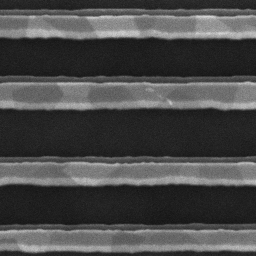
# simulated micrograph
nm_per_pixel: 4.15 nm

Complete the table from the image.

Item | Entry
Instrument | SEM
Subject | lines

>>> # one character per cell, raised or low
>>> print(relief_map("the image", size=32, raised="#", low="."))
................................
################################
################################
################################
################################
................................
................................
................................
................................
................................
################################
################################
################################
..##############......###..#####
................................
................................
................................
................................
................................
................................
################################
################################
################################
................................
................................
................................
................................
................................
################################
################################
################################
................................